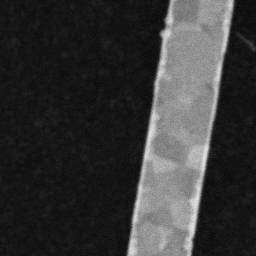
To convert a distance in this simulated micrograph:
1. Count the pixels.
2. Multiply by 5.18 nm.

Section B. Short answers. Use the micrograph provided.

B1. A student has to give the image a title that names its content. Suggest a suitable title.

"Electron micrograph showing one or a few lines or trenches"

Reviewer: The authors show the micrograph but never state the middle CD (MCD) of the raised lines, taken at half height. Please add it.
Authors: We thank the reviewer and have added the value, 59.5 pixels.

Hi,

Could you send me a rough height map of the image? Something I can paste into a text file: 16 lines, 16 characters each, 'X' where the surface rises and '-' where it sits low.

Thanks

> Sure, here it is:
-----------XXX--
----------XXXX--
----------XXXX--
----------XXXX--
----------XXXX--
----------XXXX--
----------XXX---
----------XXX---
---------XXXX---
---------XXXX---
---------XXXX---
---------XXXX---
---------XXX----
--------XXXX----
--------XXXX----
--------XXXX----